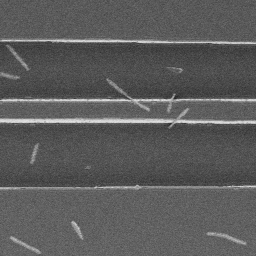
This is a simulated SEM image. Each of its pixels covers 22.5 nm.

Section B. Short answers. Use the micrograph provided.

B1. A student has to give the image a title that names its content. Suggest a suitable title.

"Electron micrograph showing lines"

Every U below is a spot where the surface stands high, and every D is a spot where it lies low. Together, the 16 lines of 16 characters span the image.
UUUUUUUUUUUUUUUU
UUUUUUUUUUUUUUUU
UUUUUUUUUUUUUUUU
DDDDDDDDDDDDDDDD
DDDDDDDDDDDDDDDD
DDDDDDDDDDDDDDDD
UUUUUUUUUUUUUUUU
UUUUUUUUUUUUUUUU
DDDDDDDDDDDDDDDD
DDDDDDDDDDDDDDDD
DDDDDDDDDDDDDDDD
DDDDDDDDDDDDDDDD
UUUUUUUUUUUUUUUU
UUUUUUUUUUUUUUUU
UUUUUUUUUUUUUUUU
UUUUUUUUUUUUUUUU